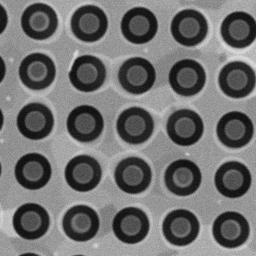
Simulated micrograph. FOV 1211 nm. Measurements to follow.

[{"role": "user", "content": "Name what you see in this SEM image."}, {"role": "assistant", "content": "an array of small figures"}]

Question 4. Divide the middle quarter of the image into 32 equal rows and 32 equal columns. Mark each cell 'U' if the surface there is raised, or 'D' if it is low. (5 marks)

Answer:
UUDDUUUDDDDDDDDDDDUDDDUUUUUDDDDD
UUDDUUUUDDDDDDDDUUUUDDDUUUUDDUUU
UDDUUUUUDDDDDDDDUUUUUDDUUUDDDUUU
UDDDUUUUDDDDDDDDUUUUUDDUUUDDUUUU
UUDDDUUDDDDUDDDDDUUUDDDUUUDDDUUU
UUDDDDDDDDUUUDDDDDDDDDUUUUUDDUUU
UUUDDDDDDUUUUUDDDDDDDUUUUUUDDDDD
UUUUUUUUUUUUUUUDDDDDUUUUUUUUDDDD
UUUUUUUUUUUUUUUUUUUUUUUUUUUUUDDD
UUUUUUUUUUUUUUUUUUUUUUUUUUUUUUUU
UUUUDDDUUUUUUUUUDDDUUUUUUUUUUDDU
UUDDDDDDDUUUUUUDDDDDDUUUUUDDDDDD
UDDDUUDDDUUUUUDDDDDDDDUUUDDDDDDD
UDDUUUUDDDUUUDDDUUUDDDDUUDDDDDDD
UDDUUUUUDDUUUDDUUUUUDDDDUDDDUUUU
UDDUUUUUDDUUUDDUUUUUDDDUUDDDUUUU
UDDUUUUDDDUUUDDDUUUUDDDUUDDDUUUU
UDDDDDDDDDUUUDDDDUUDDDUUUUDDDUUU
UUDDDDDDDUUUUUDDDDDDDDUUUUDDDDDD
UUUDDDDDUUUUUUUDDDDDDUUUUUUDDDDD
UUUUUUUUUUUUUUUUDDDUUUUUUUUUUUDU
UUUUUUUUUUUUUUUUUUUUUUUUUUUUUUUU
UUUUDDDDUUUUUUUUDDUUUUUUUUUUUUUU
UUDDDDDDDUUUUDDDDDDDUUUUUUUUUUUU
UDDDDDDDDDUUDDDDDDDDDUUUUUUDDDDD
UDDUUUDDDDUUDDDDDDDDDDUUUUDDDDDD
DDDUUUUDDDUUDDDUUUUDDDUUUDDDUUUD
DDUUUUUDDDUUDDDUUUUUDDUUUDDDUUUU
DDDUUUUDDDUUDDDUUUUUDDUUUDDDUUUU
UDDDUUDDDUUUUDDUUUUDDDUUUDDDUUUU
UDDDDDDDUUUUUDDDDDDDDDUUUDDDDUDD
UUUDDDDUUUUUUUDDDDDDDUUUUDDDDDDD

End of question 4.